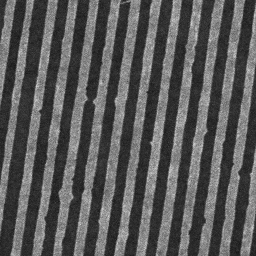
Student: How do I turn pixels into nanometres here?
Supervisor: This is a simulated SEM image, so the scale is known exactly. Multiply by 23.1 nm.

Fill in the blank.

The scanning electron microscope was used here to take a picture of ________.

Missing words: parallel lines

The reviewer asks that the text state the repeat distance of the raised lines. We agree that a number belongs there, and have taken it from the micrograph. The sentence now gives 478 nm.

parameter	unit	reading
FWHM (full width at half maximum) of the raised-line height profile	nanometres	197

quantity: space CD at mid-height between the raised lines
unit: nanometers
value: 277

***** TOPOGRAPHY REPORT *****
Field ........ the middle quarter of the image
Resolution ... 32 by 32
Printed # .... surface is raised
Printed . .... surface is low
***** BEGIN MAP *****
#...##...##...###...##...##...##
#...##...##...##....##...##...##
#...##...##...##....#....##...##
#...##...##...##....#....#....##
....##...##...##...##...##....##
....##...##...##...##...##...###
...##....##...##...##...##...###
...##...##....##...##...##...##.
...###..##...###...##...##...##.
...##...##...##...##....##...##.
...##...##...##...##....##...##.
..###...##...##...##...##....##.
..##....##...##...##...##...##..
..##....##...##...##...##...##..
..##...###...##...##...##...##..
..##...##...##....##...##...##..
..##...##...##...##....##...##..
..##...##...##...##...###...##..
..##...##...##...##...##....##..
.###...##...##...##...##....#...
.###...##...##...##...##...##...
.##...##....##...##...##...##...
.##...##...###...##...##...##...
.##...##...##....#....##...##...
.##...##...##...##...###...##...
###...##...##...##...##....##...
###...##...##...##...##...##....
##...##....##...##...##...##...#
##...##....##...##...##...##...#
##...##...###...##...##...##...#
##...##...##....##...##...##...#
##...##...###..##...###...##...#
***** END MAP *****